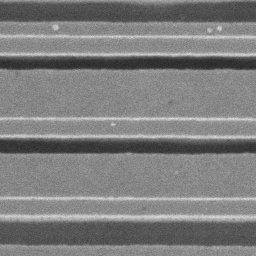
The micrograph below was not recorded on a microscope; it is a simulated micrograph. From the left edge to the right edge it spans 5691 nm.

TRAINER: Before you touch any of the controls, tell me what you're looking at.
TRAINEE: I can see lines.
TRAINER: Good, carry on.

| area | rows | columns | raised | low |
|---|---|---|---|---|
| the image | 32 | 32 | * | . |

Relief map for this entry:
................................
................................
................................
********************************
********************************
********************************
********************************
................................
................................
********************************
********************************
********************************
********************************
********************************
********************************
********************************
********************************
................................
................................
********************************
********************************
********************************
********************************
********************************
********************************
********************************
********************************
................................
................................
................................
................................
********************************